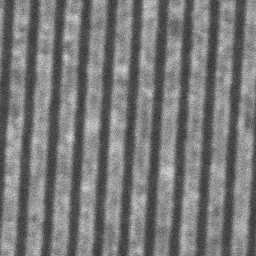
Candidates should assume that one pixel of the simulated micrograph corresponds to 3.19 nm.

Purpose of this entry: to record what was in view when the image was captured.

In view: parallel lines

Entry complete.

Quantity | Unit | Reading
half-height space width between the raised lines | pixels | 13.4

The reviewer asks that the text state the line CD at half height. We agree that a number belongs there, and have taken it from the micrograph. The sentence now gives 37 nm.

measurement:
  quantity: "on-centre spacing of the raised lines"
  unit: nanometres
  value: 81.7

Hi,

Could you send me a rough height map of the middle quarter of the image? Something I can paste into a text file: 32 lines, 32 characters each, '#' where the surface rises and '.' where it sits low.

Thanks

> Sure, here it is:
###...###....###...###....###...
###...###....###...###....###...
###...###....###...###....###...
###...###....###...###....###...
###...###....###...###....##....
###...###....###...###...####...
###...###....###...###...###....
###...###....##....###...###....
###...###...###....###...###....
###...###...###....###...###....
##....###...###....###...###....
##....###...###....###...###....
##....###...###....##....###....
##....###...###...###....###....
##....###...###...####...###...#
##....##....###...####...###...#
##...###....###...###....###...#
##...###....###...###....##....#
##...###....###...###....###...#
##...###....###...###....###...#
##...###....###...###....##....#
##...###....##....###....##....#
##...###....###...###...###....#
#....###...####...###...###....#
#....###....##....###...###....#
#....###...###....###...###....#
#....###...###....###...###....#
#....###...###....###...###...##
#....###...###....##....###....#
#....###...###....##....###....#
#....###...###....##....###....#
#....###...###....##....###...##